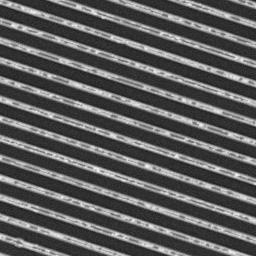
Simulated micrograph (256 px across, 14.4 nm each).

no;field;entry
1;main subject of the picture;parallel lines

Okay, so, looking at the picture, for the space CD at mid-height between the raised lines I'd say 193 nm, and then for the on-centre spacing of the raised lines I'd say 268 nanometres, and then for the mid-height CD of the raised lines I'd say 70.1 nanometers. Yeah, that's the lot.